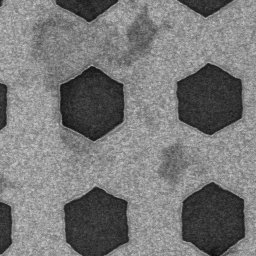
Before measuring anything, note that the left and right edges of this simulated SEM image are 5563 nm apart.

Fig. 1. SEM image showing holes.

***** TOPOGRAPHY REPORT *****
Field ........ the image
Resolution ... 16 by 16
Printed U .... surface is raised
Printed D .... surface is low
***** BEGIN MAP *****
UUUUDDDUUUUUDDUU
UUUUUUUUUUUUUUUU
UUUUUUUUUUUUUUUU
UUUUUUUUUUUUUUUU
UUUUUDUUUUUUDDUU
UUUUDDDDUUUDDDDU
UUUUDDDDUUUDDDDU
UUUUDDDDUUUDDDDU
UUUUUDUUUUUUUUUU
UUUUUUUUUUUUUUUU
UUUUUUUUUUUUUUUU
UUUUUUUUUUUUUUUU
UUUUUDDDUUUUDDDU
DUUUDDDDUUUDDDDU
DUUUDDDDUUUDDDDU
UUUUUDDUUUUUDDUU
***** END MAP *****